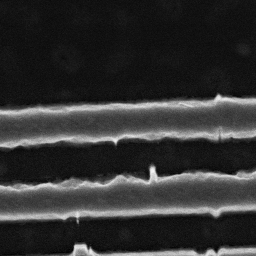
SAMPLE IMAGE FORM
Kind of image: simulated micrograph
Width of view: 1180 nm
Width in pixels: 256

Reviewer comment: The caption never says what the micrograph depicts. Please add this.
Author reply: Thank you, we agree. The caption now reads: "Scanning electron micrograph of one or a few lines or trenches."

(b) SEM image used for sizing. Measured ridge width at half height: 155 nm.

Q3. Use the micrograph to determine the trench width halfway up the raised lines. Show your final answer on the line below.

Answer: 187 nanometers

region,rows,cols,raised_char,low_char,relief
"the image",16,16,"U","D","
DDDDDDDDDDDDDDDD
DDDDDDDDDDDDDDDD
DDDDDDDDDDDDDDDD
DDDDDDDDDDDDDDDD
DDDDDDDDDDDDDDDD
DDDDDDDDDDDDDDDD
DDDDDDDDDUUUUUUU
UUUUUUUUUUUUUUUU
UUUUUUUUUUDUUUUD
DDDDDDDDDDDDDDDD
DDDDDDDDDDDDDDDD
DDDDUUUUUUUUUUUU
UUUUUUUUUUUUUUUU
UUUUUDDDDDDDDDDD
DDDDDDDDDDDDDDDD
DDDDDDDDDDDDDDDD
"